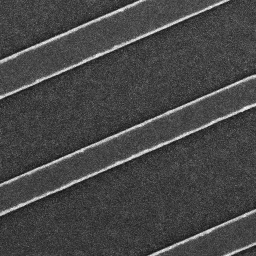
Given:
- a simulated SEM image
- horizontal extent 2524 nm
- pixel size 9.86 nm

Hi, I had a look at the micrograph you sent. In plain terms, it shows one or a few lines or trenches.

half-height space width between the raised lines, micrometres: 0.777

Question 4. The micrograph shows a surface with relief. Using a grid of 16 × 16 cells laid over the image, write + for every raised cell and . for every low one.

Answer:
........+++++...
.....++++++.....
...++++++.......
.+++++..........
++++............
++............++
............++++
.........+++++..
.......++++.....
.....++++.......
..+++++.........
+++++...........
++..............
...............+
.............+++
...........++++.